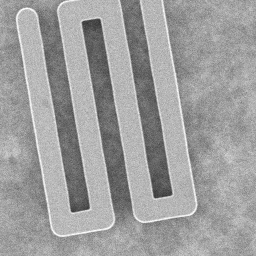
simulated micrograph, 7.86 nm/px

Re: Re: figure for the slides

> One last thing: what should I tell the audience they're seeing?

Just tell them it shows groups of lines, slits or small figures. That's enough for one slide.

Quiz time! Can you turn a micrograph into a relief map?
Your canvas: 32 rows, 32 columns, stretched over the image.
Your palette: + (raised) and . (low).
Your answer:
........+++++++...++............
..++...++++++++...+++...........
..+++..++++.+++...+++...........
..+++...++...+++..+++...........
..+++...++...+++..+++...........
...++...+++..+++...++...........
...++...+++..+++...++...........
...+++..+++...++...+++..........
...+++..+++...++...+++..........
...+++...++...+++..+++..........
...+++...++...+++..+++..........
....++...+++..+++..+++..........
....++...+++..+++...++..........
....+++..+++..+++...+++.........
....+++..+++...++...+++.........
....+++...++...+++..+++.........
....+++...++...+++..+++.........
.....++...+++..+++..+++.........
.....+++..+++..+++...++.........
.....+++..+++...++...+++........
.....+++..+++...++...+++........
.....+++..+++...+++..+++........
.....+++...+++..+++..+++........
......++...+++..+++...++........
......+++..+++..+++..+++........
......+++..+++...++++++++.......
......+++.++++...+++++++........
......++++++++...+++............
......++++++++..................
................................
................................
................................